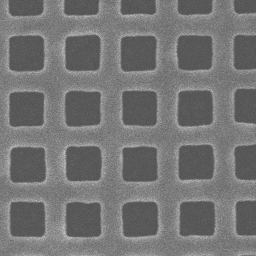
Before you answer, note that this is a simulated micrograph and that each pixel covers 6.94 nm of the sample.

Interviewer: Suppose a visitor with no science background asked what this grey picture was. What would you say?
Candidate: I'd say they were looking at a regular array of holes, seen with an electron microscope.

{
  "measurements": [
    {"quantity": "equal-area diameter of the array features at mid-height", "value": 272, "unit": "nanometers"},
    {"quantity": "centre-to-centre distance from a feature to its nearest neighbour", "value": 0.382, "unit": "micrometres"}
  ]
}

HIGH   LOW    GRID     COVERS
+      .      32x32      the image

+....+++....+++.....++.....++...
+....+++....+++....+++....++++..
++++++++++++++++++++++++++++++++
++++++++++++++++++++++++++++++++
++...++++...+++++..++++...++++..
+.....++.....++.....++.....++...
+.....++....+++.....++.....++...
+.....++.....++.....++.....++...
+....+++....+++....++++...++++..
++++++++++++++++++++++++++++++++
++++++++++++++++++++++++++++++++
++..+++++...++++...++++...+++...
+.....++.....++.....++.....++...
+.....++.....++.....++.....++...
+....+++.....++.....++.....++...
+....+++....++++...+++....++++++
++++++++++++++++++++++++++++++++
++++++++++++++++++++++++++++++++
++...+++....++++...+++....++++..
+.....++.....++.....++.....++...
+.....++.....++.....++.....++...
+.....++.....++.....++.....++...
+.....+++...++++...++++.++++++..
++++++++++++++++++++++++++++++++
++++++++++++++++++++++++++++++++
+....+++....++++....+++....+++..
+.....++.....++.....++.....++...
+.....++.....++.....++.....++...
+.....++.....++.....++.....++...
++...++++...++++...++++++.++++++
++++++++++++++++++++++++++++++++
++++++++++++++++++++++++++++++++